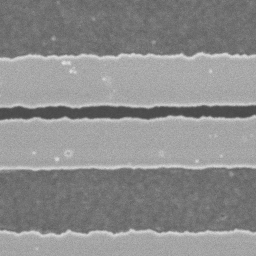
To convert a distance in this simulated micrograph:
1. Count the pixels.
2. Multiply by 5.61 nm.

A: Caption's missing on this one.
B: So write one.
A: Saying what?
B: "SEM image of lines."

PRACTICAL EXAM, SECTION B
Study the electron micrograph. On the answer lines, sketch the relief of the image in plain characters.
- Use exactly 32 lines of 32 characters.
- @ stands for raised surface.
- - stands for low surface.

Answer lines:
--------------------------------
--------------------------------
--------------------------------
--------------------------------
--------------------------------
--------------------------------
--------------------------------
@@@@@@@@@@@@@@@@@@@@@@@@@@@@@@@@
@@@@@@@@@@@@@@@@@@@@@@@@@@@@@@@@
@@@@@@@@@@@@@@@@@@@@@@@@@@@@@@@@
@@@@@@@@@@@@@@@@@@@@@@@@@@@@@@@@
@@@@@@@@@@@@@@@@@@@@@@@@@@@@@@@@
@@@@@@@@@@@@@@@@@@@@@@@@@@@@@@@@
--------------------------------
--------------------------------
@@@@@@@@@@@@@@@@@@@@@@@@@@@@@@@@
@@@@@@@@@@@@@@@@@@@@@@@@@@@@@@@@
@@@@@@@@@@@@@@@@@@@@@@@@@@@@@@@@
@@@@@@@@@@@@@@@@@@@@@@@@@@@@@@@@
@@@@@@@@@@@@@@@@@@@@@@@@@@@@@@@@
@@@@@@@@@@@@@@@@@@@@@@@@@@@@@@@@
--------------------------------
--------------------------------
--------------------------------
--------------------------------
--------------------------------
--------------------------------
--------------------------------
--------------------------------
@@@@@@@@@@@@@@@@@@@@@@@@@@@@@@@@
@@@@@@@@@@@@@@@@@@@@@@@@@@@@@@@@
@@@@@@@@@@@@@@@@@@@@@@@@@@@@@@@@